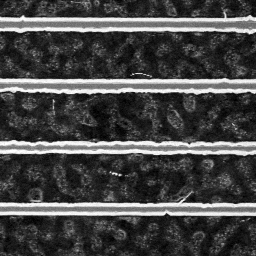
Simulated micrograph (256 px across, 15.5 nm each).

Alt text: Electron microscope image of one or a few lines or trenches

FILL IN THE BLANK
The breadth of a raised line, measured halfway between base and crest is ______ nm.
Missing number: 143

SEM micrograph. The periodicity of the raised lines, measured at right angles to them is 952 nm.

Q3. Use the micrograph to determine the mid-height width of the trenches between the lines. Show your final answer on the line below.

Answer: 810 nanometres